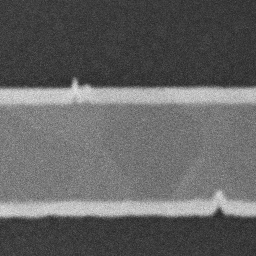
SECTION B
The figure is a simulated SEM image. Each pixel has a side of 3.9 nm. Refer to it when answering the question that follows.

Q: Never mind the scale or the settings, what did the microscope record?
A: one or a few lines or trenches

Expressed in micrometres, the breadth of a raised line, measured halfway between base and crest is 0.449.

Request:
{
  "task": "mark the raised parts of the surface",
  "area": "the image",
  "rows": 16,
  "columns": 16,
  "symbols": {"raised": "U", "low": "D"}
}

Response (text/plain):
DDDDDDDDDDDDDDDD
DDDDDDDDDDDDDDDD
DDDDDDDDDDDDDDDD
DDDDDDDDDDDDDDDD
DDDDDDDDDDDDDDDD
DDDDDDDDDDDDDDDD
UUUUUUUUUUUUUUUU
UUUUUUUUUUUUUUUU
UUUUUUUUUUUUUUUU
UUUUUUUUUUUUUUUU
UUUUUUUUUUUUUUUU
UUUUUUUUUUUUUUUU
UUUUUUUUUUUUUUUU
DDDDDDDDDDDDDDDD
DDDDDDDDDDDDDDDD
DDDDDDDDDDDDDDDD